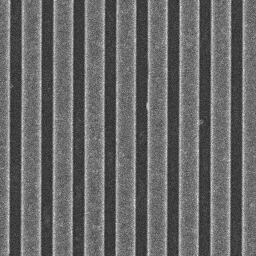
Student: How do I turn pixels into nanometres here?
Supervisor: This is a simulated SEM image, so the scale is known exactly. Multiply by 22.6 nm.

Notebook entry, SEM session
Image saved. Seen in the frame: parallel lines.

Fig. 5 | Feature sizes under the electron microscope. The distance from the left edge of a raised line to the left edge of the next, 713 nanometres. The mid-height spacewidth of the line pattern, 277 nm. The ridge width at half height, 0.435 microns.